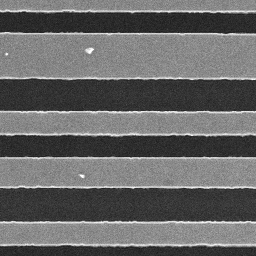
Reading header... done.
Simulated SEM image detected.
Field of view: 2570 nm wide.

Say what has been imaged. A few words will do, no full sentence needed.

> lines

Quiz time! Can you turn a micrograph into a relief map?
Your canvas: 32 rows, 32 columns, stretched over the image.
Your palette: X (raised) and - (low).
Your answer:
XXXXXXXXXXXXXXXXXXXXXXXXXXXXXXXX
-X--XXX---XXXXX-X-XXXXXXXXXXXXXX
--------------------------------
--------------------------------
XXXXXXXXXXXXXXXXXXXXXXXXXXXXXXXX
XXXXXXXXXXXXXXXXXXXXXXXXXXXXXXXX
XXXXXXXXXXXXXXXXXXXXXXXXXXXXXXXX
XXXXXXXXXXXXXXXXXXXXXXXXXXXXXXXX
XXXXXXXXXXXXXXXXXXXXXXXXXXXXXXXX
XXXXXXXXXXXXXXXXXXXXXXXXXXXXXXXX
--------------------------------
--------------------------------
--------------------------------
--------------------------------
XXXXXXXXXXXXXXXXXXXXXXXXXXXXXXXX
XXXXXXXXXXXXXXXXXXXXXXXXXXXXXXXX
XXXXXXXXXXXXXXXXXXXXXXXXXXXXXXXX
--------------------------------
--------------------------------
--------------------------------
XXXXXXXXXXXXXXXXXXXXXXXXXXXXXXXX
XXXXXXXXXXXXXXXXXXXXXXXXXXXXXXXX
XXXXXXXXXXXXXXXXXXXXXXXXXXXXXXXX
----------X-----X-----XXXXXXXXXX
--------------------------------
--------------------------------
--------------------------------
--------------------------------
XXXXXXXXXXXXXXXXXXXXXXXXXXXXXXXX
XXXXXXXXXXXXXXXXXXXXXXXXXXXXXXXX
XXXXXXXXXXXXXXXXXXXXXXXXXXXXXXXX
--------------------------------